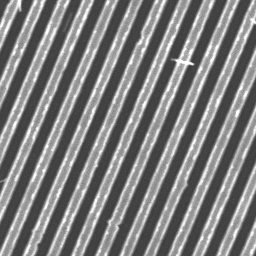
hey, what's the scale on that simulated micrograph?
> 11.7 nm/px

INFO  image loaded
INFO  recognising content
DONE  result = parallel lines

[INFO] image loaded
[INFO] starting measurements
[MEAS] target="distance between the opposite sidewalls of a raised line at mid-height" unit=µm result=0.135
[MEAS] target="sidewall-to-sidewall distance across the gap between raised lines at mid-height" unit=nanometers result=125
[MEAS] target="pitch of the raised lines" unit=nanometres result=261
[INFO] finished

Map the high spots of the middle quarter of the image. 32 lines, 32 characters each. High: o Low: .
o...ooo...ooo...ooo...ooo...ooo.
...ooo...ooo...ooo....oo...ooo..
...ooo...ooo...ooo...ooo...ooo..
...oo....oo....ooo...ooo...ooo..
..ooo...ooo...ooo...ooo...ooo...
.ooo....ooo...ooo...ooo...ooo...
.ooo...ooo...ooo...ooo...ooo...o
.ooo...ooo...ooo...ooo...ooo...o
ooo....oo....oo...ooo...oooo..oo
ooo...ooo...ooo...ooo...ooo...oo
oo....oo....ooo...ooo...ooo...oo
oo...ooo...ooo...ooo...ooo...ooo
oo...ooo...ooo...ooo...ooo...ooo
o...ooo...ooo...ooo...ooo...ooo.
o...ooo...ooo...ooo...ooo...ooo.
...ooo....oo...ooo...oooo...ooo.
...ooo...ooo...ooo...ooo...ooo..
...ooo...ooo...oo....ooo...ooo..
..ooo...ooo...ooo...ooo...ooo...
..ooo...ooo...ooo...ooo...ooo...
.ooo...ooo...ooo...ooo....oo....
.ooo...ooo...ooo...ooo...ooo...o
ooo...ooo...oooo...ooo...ooo...o
ooo...ooo...ooo...ooo...ooo...oo
oo....ooo...oo....ooo...ooo...oo
oo...ooo...ooo...ooo...ooo....oo
oo...ooo...ooo...ooo...ooo...ooo
o...ooo...ooo...ooo...oooo..ooo.
o...ooo...ooo...ooo...ooo...ooo.
...oooo..oooo...ooo...oo....ooo.
...ooo...ooo...ooo...ooo...oooo.
...ooo...ooo...ooo...ooo...ooo..